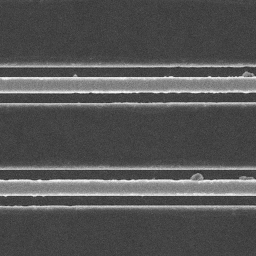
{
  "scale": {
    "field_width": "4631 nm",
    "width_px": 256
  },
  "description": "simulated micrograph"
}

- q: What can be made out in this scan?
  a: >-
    lines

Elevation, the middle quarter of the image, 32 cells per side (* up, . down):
................................
................................
................................
******.*************************
********************************
********************************
********************************
................................
................................
................................
********************************
********************************
********************************
********************************
********************************
********************************
********************************
********************************
********************************
********************************
********************************
********************************
********************************
********************************
********************************
********************************
................................
................................
................................
********************************
********************************
********************************